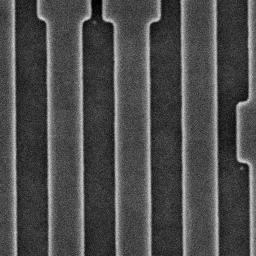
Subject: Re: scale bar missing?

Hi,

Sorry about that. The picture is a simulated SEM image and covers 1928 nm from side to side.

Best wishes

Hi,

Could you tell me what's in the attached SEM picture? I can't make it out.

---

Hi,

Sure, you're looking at wiring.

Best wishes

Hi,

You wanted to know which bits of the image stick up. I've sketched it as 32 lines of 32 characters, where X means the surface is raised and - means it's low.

XX---XXXXXX--XXXXXXX---XXXX----X
XX---XXXXXX--XXXXXXX---XXXX----X
XX---XXXXXX--XXXXXXX---XXXX----X
XX----XXXX----XXXXX----XXXX----X
XX----XXXX----XXXXX----XXXX----X
XX----XXXX----XXXXX----XXXX----X
XX----XXXX----XXXXX----XXXX----X
XX----XXXX----XXXXX----XXXX----X
XX----XXXX----XXXXX----XXXX----X
XX----XXXX----XXXXX----XXXX----X
XX----XXXX----XXXXX----XXXX----X
XX----XXXX----XXXXX----XXXX----X
XX----XXXX----XXXXX----XXXX----X
XX----XXXX----XXXXX----XXXX---XX
XX----XXXX----XXXXX----XXXX---XX
XX----XXXX----XXXXX----XXXX---XX
XX----XXXX----XXXXX----XXXX---XX
XX----XXXX----XXXXX----XXXX---XX
XX----XXXX----XXXXX----XXXX---XX
XX----XXXX----XXXXX----XXXX---XX
XX----XXXX----XXXXX----XXXX----X
XX----XXXX----XXXXX----XXXX----X
XX----XXXX----XXXXX----XXXX----X
XX----XXXX----XXXXX----XXXX----X
XX----XXXX----XXXXX----XXXX----X
XX----XXXX----XXXXX----XXXX----X
XX----XXXX----XXXXX----XXXX----X
XX----XXXX-----XXXX----XXXX----X
XX----XXXX-----XXXX----XXXX----X
XX----XXXX-----XXXX----XXXX----X
XX----XXXX-----XXXX----XXXX----X
XX----XXXX-----XXXX----XXXX----X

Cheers